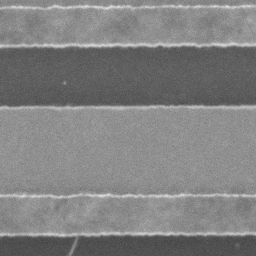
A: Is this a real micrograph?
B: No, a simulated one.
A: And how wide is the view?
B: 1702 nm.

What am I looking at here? lines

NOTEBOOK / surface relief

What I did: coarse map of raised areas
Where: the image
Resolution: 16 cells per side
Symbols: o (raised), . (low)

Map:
oooooooooooooooo
oooooooooooooooo
oooooooooooooooo
................
................
................
................
oooooooooooooooo
oooooooooooooooo
oooooooooooooooo
oooooooooooooooo
oooooooooooooooo
oooooooooooooooo
oooooooooooooooo
oooooooooooooooo
................